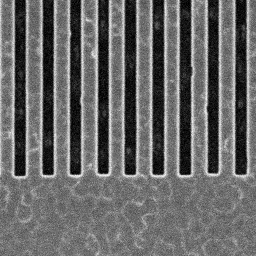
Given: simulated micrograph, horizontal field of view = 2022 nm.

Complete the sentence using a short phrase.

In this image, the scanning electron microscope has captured parallel lines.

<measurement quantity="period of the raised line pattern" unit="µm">0.218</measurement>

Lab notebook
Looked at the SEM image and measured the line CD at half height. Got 118 nanometers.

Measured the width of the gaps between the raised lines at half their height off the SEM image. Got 95.8 nm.